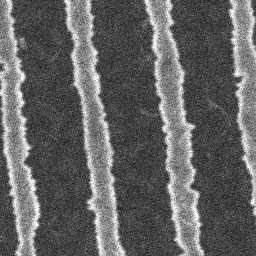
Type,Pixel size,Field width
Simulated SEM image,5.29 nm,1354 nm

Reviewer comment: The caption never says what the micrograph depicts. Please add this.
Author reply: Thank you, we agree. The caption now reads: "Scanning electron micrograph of one or a few lines or trenches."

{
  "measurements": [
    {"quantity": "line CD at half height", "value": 113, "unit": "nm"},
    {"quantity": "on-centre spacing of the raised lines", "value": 0.423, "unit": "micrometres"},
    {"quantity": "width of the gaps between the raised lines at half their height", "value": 301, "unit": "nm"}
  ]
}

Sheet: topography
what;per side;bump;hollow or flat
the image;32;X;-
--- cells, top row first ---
X-------XXX-------XXX--------XX-
X-------XXX--------XX--------XXX
XX------XXXX-------XX--------XXX
X--------XXX-------XX--------XXX
XX-------XX--------XX--------XX-
XX-------XX--------XXX-------XXX
XX-------XXX-------XXX-------XXX
XX-------XXX--------XX-------XXX
-X-------XXX-------XXXX------XXX
XXX------XXX-------XXXX-------XX
XXX------XXX--------XXX-------XX
XX--------XX--------XXX-------XX
XXX-------XX--------XXX-------XX
XXX-------XXX-------XXX-------XX
XXX-------XXX-------XXX-------XX
XXX--------XX--------XXX------XX
-XX--------XX--------XXX------XX
-XX--------XXX-------XXX------XX
-XXX-------XXX-------XXX-------X
-XX--------XXX-------XXX-------X
-XX--------XXX-------XXX-------X
-XXX-------XXX-------XXX-------X
-XXX-------XXX-------XXX--------
--XX--------XX-------XXX--------
--XX--------XX-------XXXX-------
--XXX------XXX--------XXX-------
--XXX-------XXX-------XXX-------
--XXX-------XXX-------XXX-------
--XX--------XXX-------XXX-------
--XX--------XXX-------XXX-------
--XX--------XXX-------XXX-------
--XX--------XXX--------XX-------